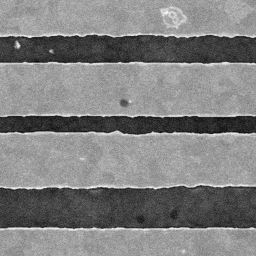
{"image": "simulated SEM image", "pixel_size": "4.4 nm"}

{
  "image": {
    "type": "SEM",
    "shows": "lines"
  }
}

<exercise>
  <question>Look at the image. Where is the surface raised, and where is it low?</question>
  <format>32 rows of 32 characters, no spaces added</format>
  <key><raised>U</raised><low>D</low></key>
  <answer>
UUUUUUUUUUUUUUUUUUUUUUUUUUUUUUUU
UUUUUUUUUUUUUUUUUUUUUUUUUUUUUUUU
UUUUUUUUUUUUUUUUUUUUUUUUUUUUUUUU
UUUUUUUUUUUUUUUUUUUUUUUUUUUUUUUU
UUUUUUUDUDUDDDUUDDDDUUUUUDDUUUUU
DDDDDDDDDDDDDDDDDDDDDDDDDDDDDDDD
DDDDDDDDDDDDDDDDDDDDDDDDDDDDDDDD
DDDDDDDDDDDDDDDDDDDDDDDDDDDDDDDD
UUUUUUUUUUUUUUUUUUUUUUUUUUUUUUUU
UUUUUUUUUUUUUUUUUUUUUUUUUUUUUUUU
UUUUUUUUUUUUUUUUUUUUUUUUUUUUUUUU
UUUUUUUUUUUUUUUUUUUUUUUUUUUUUUUU
UUUUUUUUUUUUUUUUUUUUUUUUUUUUUUUU
UUUUUUUUUUUUUUUUUUUUUUUUUUUUUUUU
UDUDDDDDUUDDUUDDUUUUUUUUUUUUUUDU
DDDDDDDDDDDDDDDDDDDDDDDDDDDDDDDD
DDDDDDDDDDDDDDUDDDDDDDDDDDDDDDDD
UUUUUUUUUUUUUUUUUUUUUUUUUUUUUUUU
UUUUUUUUUUUUUUUUUUUUUUUUUUUUUUUU
UUUUUUUUUUUUUUUUUUUUUUUUUUUUUUUU
UUUUUUUUUUUUUUUUUUUUUUUUUUUUUUUU
UUUUUUUUUUUUUUUUUUUUUUUUUUUUUUUU
UUUUUUUUUUUUUUUUUUUUUUUUUUUUUUUU
DUUUUDDDDUUDDDDDDDDUDDDDDDDDDDDD
DDDDDDDDDDDDDDDDDDDDDDDDDDDDDDDD
DDDDDDDDDDDDDDDDDDDDDDDDDDDDDDDD
DDDDDDDDDDDDDDDDDDDDDDDDDDDDDDDD
DDDDDDDDDDDDDDDDDDDDDDDDDDDDDDDD
DDDDDDDDDDDDDDDDDDDDDDDDDDDDDDDD
UUUUUUUUUUUUUUUUUUUUUUUUUUUUUUUU
UUUUUUUUUUUUUUUUUUUUUUUUUUUUUUUU
UUUUUUUUUUUUUUUUUUUUUUUUUUUUUUUU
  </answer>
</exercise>